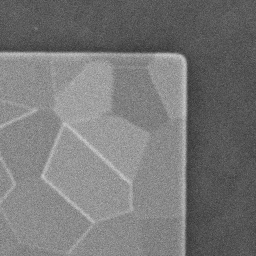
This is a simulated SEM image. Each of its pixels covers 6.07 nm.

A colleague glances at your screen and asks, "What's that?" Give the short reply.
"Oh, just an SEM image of wiring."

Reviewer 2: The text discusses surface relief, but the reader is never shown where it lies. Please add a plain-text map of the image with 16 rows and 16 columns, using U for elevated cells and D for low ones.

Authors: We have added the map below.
DDDDDDDDDDDDDDDD
DDDDDDDDDDDDDDDD
DDDDDDDDDDDDDDDD
UUUUUUUUUUUDDDDD
UUUUUUUUUUUUDDDD
UUUUUUUUUUUUDDDD
UUUUUUUUUUUUDDDD
UUUUUUUUUUUUDDDD
UUUUUUUUUUUUDDDD
UUUUUUUUUUUUDDDD
UUUUUUUUUUUUDDDD
UUUUUUUUUUUUDDDD
UUUUUUUUUUUUDDDD
UUUUUUUUUUUUDDDD
UUUUUUUUUUUUDDDD
UUUUUUUUUUUUDDDD